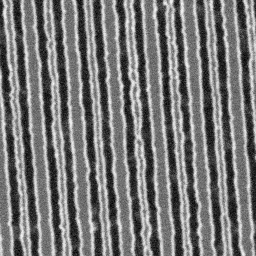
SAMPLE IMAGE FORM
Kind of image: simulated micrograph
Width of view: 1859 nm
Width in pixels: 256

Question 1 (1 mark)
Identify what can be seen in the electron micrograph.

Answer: parallel lines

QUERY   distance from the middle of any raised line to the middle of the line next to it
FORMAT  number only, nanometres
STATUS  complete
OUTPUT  145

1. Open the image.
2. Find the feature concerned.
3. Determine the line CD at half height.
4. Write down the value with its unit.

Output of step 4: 85 nm